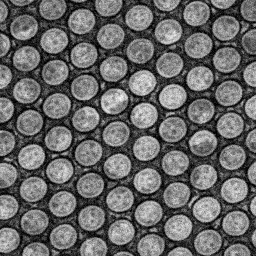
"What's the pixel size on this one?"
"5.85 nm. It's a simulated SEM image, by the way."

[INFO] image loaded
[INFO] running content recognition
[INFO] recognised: a regular array of raised bodies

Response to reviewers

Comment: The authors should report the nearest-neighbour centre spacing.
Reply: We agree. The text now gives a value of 0.187 micrometres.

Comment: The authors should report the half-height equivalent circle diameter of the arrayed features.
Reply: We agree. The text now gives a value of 24.3 pixels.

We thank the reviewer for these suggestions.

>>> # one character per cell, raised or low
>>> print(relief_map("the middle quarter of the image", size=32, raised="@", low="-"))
----@@---@@@@@@@-------@@@@@@---
@--------@@@@@@--------@@@@@@---
@---------@@@@@---@@@@--@@@@---@
----@@@---@@@@---@@@@@---------@
--@@@@@@---------@@@@@@--------@
--@@@@@@---------@@@@@----@@@--@
--@@@@@@----@@---@@@@@---@@@@@--
--@@@@@@--@@@@@---@@----@@@@@@--
@---@@----@@@@@@--------@@@@@@--
@---------@@@@@@--------@@@@@@--
@---------@@@@@----@@@---@@@@---
@---@@@---@@@@----@@@@@--------@
---@@@@@---------@@@@@@--------@
--@@@@@@---------@@@@@@---------
--@@@@@@---------@@@@@---@@@@@--
---@@@@@---@@@@---@@@---@@@@@@--
@---@@----@@@@@@--------@@@@@@--
@@--------@@@@@@--------@@@@@@--
@@--------@@@@@@----@@---@@@@---
@@---@@@---@@@@---@@@@@---------
@---@@@@@---------@@@@@@--------
---@@@@@@---------@@@@@---------
---@@@@@@---------@@@@@---@@@@--
---@@@@@@---@@@@---@@@---@@@@@@-
@---@@@@---@@@@@---------@@@@@@-
@@--------@@@@@@@--------@@@@@@-
@@--------@@@@@@-----@---@@@@@--
@@----@@---@@@@----@@@@---@@----
@----@@@@---@-----@@@@@@--------
----@@@@@@--------@@@@@@--------
---@@@@@@@--------@@@@@@--@@@@--
----@@@@@----@@@---@@@@---@@@@@-